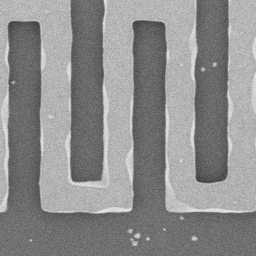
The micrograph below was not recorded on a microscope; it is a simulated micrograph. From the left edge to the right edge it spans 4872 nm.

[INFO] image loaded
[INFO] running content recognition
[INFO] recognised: groups of lines, slits or small figures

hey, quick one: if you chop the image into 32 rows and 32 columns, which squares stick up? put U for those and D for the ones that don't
UUUUUUUUUDDDDUUUUUUUUUUUDDDDDUUU
UUUUUUUUUDDDDUUUUUUUUUUUDDDDDUUU
UUUUUUUUUDDDDUUUUDUUUUUUDDDDDUUU
UDDDDUUUUDDDDUUUUDDDDUUUDDDDDUUU
UDDDDUUUUDDDDUUUUDDDDUUUDDDDDUUU
UDDDDUUUUDDDDUUUUDDDDUUUDDDDDUUU
UDDDDUUUUDDDDUUUUDDDDUUUDDDDDUUU
UDDDDUUUUDDDDUUUUDDDDUUUDDDDDUUU
UDDDDUUUUDDDDUUUUDDDDUUUDDDDDUUU
UDDDDUUUUDDDDUUUUDDDDUUUDDDDDUUU
UDDDDUUUUDDDDUUUUDDDDUUUDDDDDUUU
UDDDDUUUUDDDDUUUUDDDDUUUDDDDDUUU
UDDDDUUUUDDDDUUUUDDDDUUUDDDDDUUU
UDDDDUUUUDDDDUUUDDDDDUUUDDDDDUUU
DDDDDUUUUDDDDUUUDDDDDUUUDDDDDUUU
UDDDDUUUUDDDDUUUDDDDDUUUDDDDDUUU
UDDDDUUUUDDDDUUUDDDDDUUUDDDDDUUU
UDDDDUUUDDDDDUUUUDDDDUUUDDDDDUUU
UDDDDUUUDDDDDUUUUDDDDUUUDDDDDUUU
UDDDDUUUUDDDDUUUDDDDDUUUDDDDDUUU
UDDDDUUUUDDDDUUUDDDDDUUUDDDDDUUU
UDDDDUUUUDDDDUUUDDDDDUUUDDDDUUUU
UDDDDUUUUDDDDUUUDDDDDUUUUDDDUUUU
UDDDDUUUUUUUUUUUUDDDDUUUUUUUUUUU
UDDDDUUUUUUUUUUUUDDDDUUUUUUUUUUU
DDDDDUUUUUUUUUUUUDDDDDUUUUUUUUUU
DDDDDDDDDDDUDDDDDDDDDDDDDDDDDDDD
DDDDDDDDDDDDDDDDDDDDDDDDDDDDDDDD
DDDDDDDDDDDDDDDDDDDDDDDDDDDDDDDD
DDDDDDDDDDDDDDDDDDDDDDDDDDDDDDDD
DDDDDDDDDDDDDDDDDDDDDDDDDDDDDDDD
DDDDDDDDDDDDDDDDDDDDDDDDDDDDDDDD